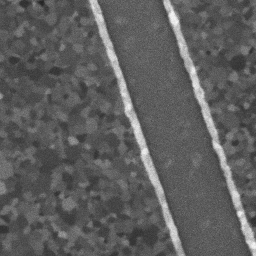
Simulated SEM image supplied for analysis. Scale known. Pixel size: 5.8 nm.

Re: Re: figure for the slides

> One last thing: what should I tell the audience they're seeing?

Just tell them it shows one or a few lines or trenches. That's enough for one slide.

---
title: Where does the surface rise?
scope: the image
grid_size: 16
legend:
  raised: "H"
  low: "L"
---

HHHHHHLLLLLHHHHH
HHHHHHLLLLLHHHHH
HHHHHHHLLLLHHHHH
HHHHHHHLLLLLHHHH
HHHHHHHLLLLLHHHH
HHHHHHHHLLLLHHHH
HHHHHHHHLLLLLHHH
HHHHHHHHLLLLLHHH
HHHHHHHHHLLLLHHH
HHHHHHHHHLLLLLHH
HHHHHHHHHLLLLLHH
HHHHHHHHHHLLLLHH
HHHHHHHHHHLLLLLH
HHHHHHHHHHLLLLLH
HHHHHHHHHHHLLLLH
HHHHHHHHHHHLLLLL